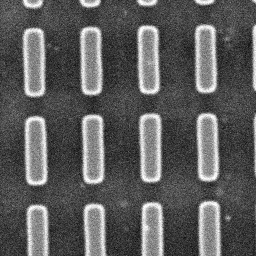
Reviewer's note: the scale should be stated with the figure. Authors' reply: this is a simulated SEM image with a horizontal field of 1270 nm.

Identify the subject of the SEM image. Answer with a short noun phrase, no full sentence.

groups of lines, slits or small figures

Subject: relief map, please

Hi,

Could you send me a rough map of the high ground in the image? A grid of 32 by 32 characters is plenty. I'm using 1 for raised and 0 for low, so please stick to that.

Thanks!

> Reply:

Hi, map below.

00011000001100000010000000000000
00000000000000000000000000000000
00000000000000000000000000000000
00000000000000000010000001100000
00011000001110000111000001100000
00011000001110000111000001100000
00011000001110000111000001100000
00011000001110000111000001100000
00011000001110000111000001100000
00011000001110000011000001100000
00011000001110000011000001100000
00011000000100000010000000000000
00000000000000000000000000000000
00000000000000000000000000000000
00000000000000000011000001100000
00011100001110000011000001100000
00011100001110000011000001100000
00011100000110000011000001100000
00011100000110000011000001100000
00011100000110000011000001100000
00011100000110000011000001100000
00011100000110000011000001100000
00011100000110000011000000000000
00000000000000000000000000000000
00000000000000000000000000000000
00000000000000000000000001100000
00001100000110000011000001100000
00001100000110000011000001100000
00001100000110000011000001100000
00001100000110000011000001100000
00001100000110000011000001100000
00001100000110000011000001100000